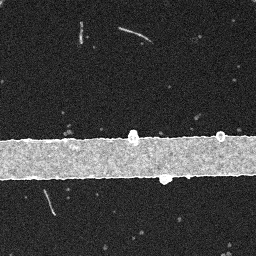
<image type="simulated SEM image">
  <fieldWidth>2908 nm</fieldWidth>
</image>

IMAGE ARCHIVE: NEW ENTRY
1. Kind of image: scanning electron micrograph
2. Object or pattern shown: one or a few lines or trenches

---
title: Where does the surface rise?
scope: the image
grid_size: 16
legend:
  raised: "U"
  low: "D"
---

DDDDDDDDDDDDDDDD
DDDDDDDDDDDDDDDD
DDDDDDDDDDDDDDDD
DDDDDDDDDDDDDDDD
DDDDDDDDDDDDDDDD
DDDDDDDDDDDDDDDD
DDDDDDDDDDDDDDDD
DDDDDDDDDDDDDDDD
DDDDDDDDUDDDDUUD
UUUUUUUUUUUUUUUU
UUUUUUUUUUUUUUUU
DDDDDDDDDDDDDDDD
DDDDDDDDDDDDDDDD
DDDDDDDDDDDDDDDD
DDDDDDDDDDDDDDDD
DDDDDDDDDDDDDDDD